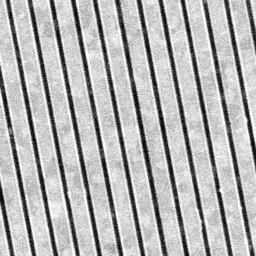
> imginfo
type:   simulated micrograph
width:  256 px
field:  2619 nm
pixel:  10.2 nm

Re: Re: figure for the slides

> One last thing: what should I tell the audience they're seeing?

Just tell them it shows parallel lines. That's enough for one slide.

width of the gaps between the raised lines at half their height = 69.1 nm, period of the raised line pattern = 220 nm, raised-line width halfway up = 157 nanometres